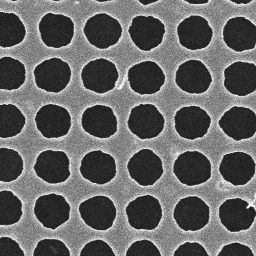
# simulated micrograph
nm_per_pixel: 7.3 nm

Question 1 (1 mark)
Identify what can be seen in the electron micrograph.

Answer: a regular array of holes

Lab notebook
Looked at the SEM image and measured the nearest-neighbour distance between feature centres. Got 45.2 pixels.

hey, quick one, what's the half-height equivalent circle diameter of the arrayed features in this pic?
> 258 nm